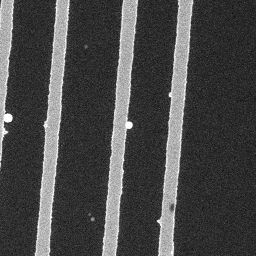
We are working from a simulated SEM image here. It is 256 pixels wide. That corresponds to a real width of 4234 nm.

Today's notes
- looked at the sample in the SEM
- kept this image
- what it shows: one or a few lines or trenches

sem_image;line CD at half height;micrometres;0.216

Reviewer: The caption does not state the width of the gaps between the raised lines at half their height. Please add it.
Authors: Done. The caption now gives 715 nm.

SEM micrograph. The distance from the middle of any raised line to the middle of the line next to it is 61.2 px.